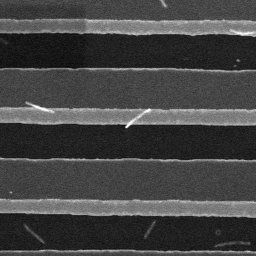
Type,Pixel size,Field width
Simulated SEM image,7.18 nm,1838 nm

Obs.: lines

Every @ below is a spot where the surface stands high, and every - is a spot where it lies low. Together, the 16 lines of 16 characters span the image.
@@@@@@@@@@@@@@@@
@@@@@@@@@@@@@@@@
----------------
----------------
@@@@@@@@@@@@@@@@
@@@@@@@@@@@@@@@@
@@@@@@@@@@@@@@@@
@@@@@@@@@@@@@@@@
----------------
----------------
@@@@@@@@@@@@@@@@
@@@@@@@@@@@@@@@@
@@@@@@@@@@@@@@@@
------------@@@@
----------------
----------------